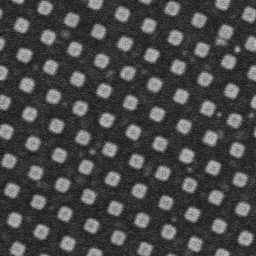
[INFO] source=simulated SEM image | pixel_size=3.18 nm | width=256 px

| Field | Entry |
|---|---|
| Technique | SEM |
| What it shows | a regular array of raised bodies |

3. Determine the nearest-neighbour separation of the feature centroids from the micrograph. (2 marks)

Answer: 92.1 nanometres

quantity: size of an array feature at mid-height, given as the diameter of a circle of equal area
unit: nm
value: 42.8